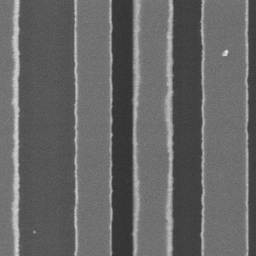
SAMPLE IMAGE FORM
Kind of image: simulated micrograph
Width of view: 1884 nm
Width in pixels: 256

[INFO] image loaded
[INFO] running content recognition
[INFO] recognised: lines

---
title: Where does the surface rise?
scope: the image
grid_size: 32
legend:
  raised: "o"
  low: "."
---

oo.......ooooo...ooooo...oooooo.
oo.......ooooo...ooooo...oooooo.
oo.......ooooo...ooooo...oooooo.
oo.......ooooo...ooooo...oooooo.
oo.......ooooo...ooooo...oooooo.
oo.......ooooo...ooooo...oooooo.
oo.......ooooo...ooooo...oooooo.
oo.......ooooo...ooooo...oooooo.
oo.......ooooo...ooooo...oooooo.
oo.......ooooo...ooooo...oooooo.
oo........oooo...ooooo...oooooo.
oo........oooo...ooooo...oooooo.
oo........oooo...oooo....oooooo.
oo.......ooooo...oooo....oooooo.
oo.......ooooo...oooo....oooooo.
oo.......ooooo...ooooo...oooooo.
oo.......ooooo...ooooo...oooooo.
oo.......ooooo...ooooo...oooooo.
oo........oooo...ooooo...oooooo.
oo.......ooooo...ooooo...oooooo.
oo.......ooooo...ooooo...oooooo.
oo.......ooooo...ooooo...oooooo.
oo........oooo...ooooo...oooooo.
oo.......ooooo...ooooo...oooooo.
oo........oooo...ooooo...oooooo.
oo........oooo...ooooo...oooooo.
oo.......ooooo...ooooo...oooooo.
oo.......ooooo...ooooo...oooooo.
oo.......ooooo...ooooo...oooooo.
oo........oooo...ooooo...oooooo.
oo........oooo...ooooo...oooooo.
oo.......ooooo...ooooo...oooooo.